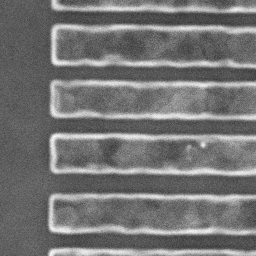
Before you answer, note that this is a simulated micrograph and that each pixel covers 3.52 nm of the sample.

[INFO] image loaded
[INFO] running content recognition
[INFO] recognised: wiring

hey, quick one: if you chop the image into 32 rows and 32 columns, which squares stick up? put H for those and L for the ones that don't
LLLLLLLHHHHHHHHHHHHHHHHHHHHHHHHH
LLLLLLLLLLLLLLLLLLLLLLLLLLLLLLLL
LLLLLLLLLLLLLLLLLLLLLLLLLLLLLLLL
LLLLLLLHHHHLLLHHHHHHLLLLLHHHLLLL
LLLLLLLHHHHHHHHHHHHHHHHHHHHHHHHH
LLLLLLLHHHHHHHHHHHHHHHHHHHHHHHHH
LLLLLLLHHHHHHHHHHHHHHHHHHHHHHHHH
LLLLLLLHHHHHHHHHHHHHHHHHHHHHHHHH
LLLLLLLLLLLLLLLLLLLLLLLLLLLLLLLL
LLLLLLLLLLLLLLLLLLLLLLLLLLLLLLLL
LLLLLLLHHHHHHHHHHLLLHHHHHHHHLLHH
LLLLLLLHHHHHHHHHHHHHHHHHHHHHHHHH
LLLLLLLHHHHHHHHHHHHHHHHHHHHHHHHH
LLLLLLLHHHHHHHHHHHHHHHHHHHHHHHHH
LLLLLLLHHLLLHHHHHHHHHHHHHHHHHHHH
LLLLLLLLLLLLLLLLLLLLLLLLLLLLLLLL
LLLLLLLLLLLLLLLLLLLLLLLLLLLLLLLL
LLLLLLLHHHHHHHHHHHHHHHHHHHHHHHHH
LLLLLLLHHHHHHHHHHHHHHHHHHHHHHHHH
LLLLLLLHHHHHHHHHHHHHHHHHHHHHHHHH
LLLLLLLHHHHHHHHHHHHHHHHHHHHHHHHH
LLLLLLLLLLLLLLLHLLLLLHHHHLHHHHHH
LLLLLLLLLLLLLLLLLLLLLLLLLLLLLLLL
LLLLLLLLLLLLLLLLLLLLLLLLLLLLLLLL
LLLLLLLLLLLLLHHHHHLLLLLLLLLLLLLL
LLLLLLHHHHHHHHHHHHHHHHHHHHHHHHHH
LLLLLLHHHHHHHHHHHHHHHHHHHHHHHHHH
LLLLLLHHHHHHHHHHHHHHHHHHHHHHHHHH
LLLLLLHHHHHHHHHHHHHHHHHHHHHHHHHH
LLLLLLLLLLLLLLLLLLLLLLLLLLLLLLLL
LLLLLLLLLLLLLLLLLLLLLLLLLLLLLLLL
LLLLLLLHHHHHHHHHLLLHHLHHHHHHHLLL